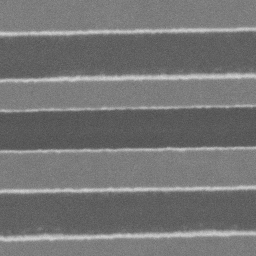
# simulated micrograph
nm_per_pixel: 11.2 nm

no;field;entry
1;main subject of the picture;lines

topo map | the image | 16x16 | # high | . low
################
################
................
................
................
################
################
................
................
################
################
################
................
................
................
################